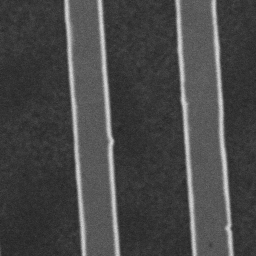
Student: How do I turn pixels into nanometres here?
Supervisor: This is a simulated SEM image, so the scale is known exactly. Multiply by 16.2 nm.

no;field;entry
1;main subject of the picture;one or a few lines or trenches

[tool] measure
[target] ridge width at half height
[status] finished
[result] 0.579 micrometres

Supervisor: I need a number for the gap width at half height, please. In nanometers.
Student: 1230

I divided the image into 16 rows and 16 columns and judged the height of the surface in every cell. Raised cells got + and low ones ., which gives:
....++.....++...
....++.....++...
....++.....+++..
....++.....+++..
....+++....+++..
....+++....+++..
.....++....+++..
.....++.....++..
.....++.....++..
.....++.....++..
.....++.....++..
.....++.....++..
.....++.....++..
.....++.....++..
.....++.....++..
.....++.....++..